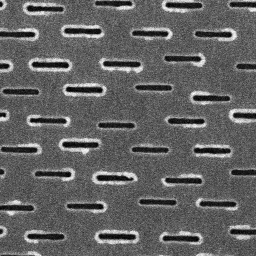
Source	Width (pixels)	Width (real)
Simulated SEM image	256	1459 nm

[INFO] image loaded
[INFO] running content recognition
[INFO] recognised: a regular array of holes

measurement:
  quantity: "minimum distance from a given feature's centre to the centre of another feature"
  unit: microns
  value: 0.23